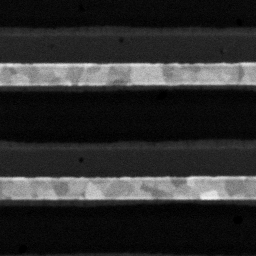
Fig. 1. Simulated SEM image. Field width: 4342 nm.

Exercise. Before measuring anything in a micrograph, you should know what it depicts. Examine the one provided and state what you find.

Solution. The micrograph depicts lines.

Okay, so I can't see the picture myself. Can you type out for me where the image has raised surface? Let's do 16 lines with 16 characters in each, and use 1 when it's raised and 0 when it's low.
0000000000000000
0000000000000000
1111111111111111
1111111111111111
1111111111111111
0000000000000000
0000000000000000
0000000000000000
0000000000000000
1111111111111111
1111111111111111
1111111111111111
1111111111101111
0000000000000000
0000000000000000
0000000000000000